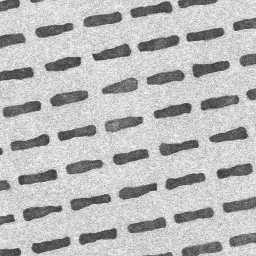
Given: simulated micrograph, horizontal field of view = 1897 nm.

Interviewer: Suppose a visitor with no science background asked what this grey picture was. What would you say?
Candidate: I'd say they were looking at a regular array of holes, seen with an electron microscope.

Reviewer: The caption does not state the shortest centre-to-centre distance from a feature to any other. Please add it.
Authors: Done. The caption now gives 257 nm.